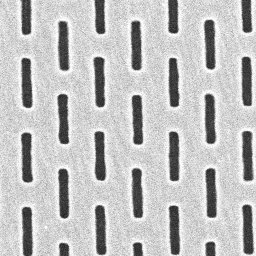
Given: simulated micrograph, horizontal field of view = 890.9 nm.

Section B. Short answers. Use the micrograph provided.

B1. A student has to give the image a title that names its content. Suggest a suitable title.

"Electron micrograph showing a regular array of holes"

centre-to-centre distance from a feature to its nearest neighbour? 179 nm